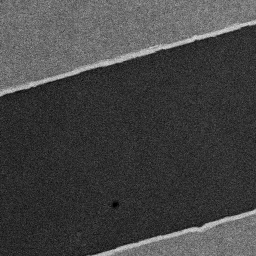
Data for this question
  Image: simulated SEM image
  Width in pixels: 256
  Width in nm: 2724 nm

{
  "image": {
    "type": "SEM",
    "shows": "one or a few lines or trenches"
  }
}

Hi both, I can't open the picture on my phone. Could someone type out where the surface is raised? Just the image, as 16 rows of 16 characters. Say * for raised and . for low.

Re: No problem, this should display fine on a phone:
****************
***************.
************....
********........
*****...........
*...............
................
................
................
................
................
................
................
...............*
...........*****
........********